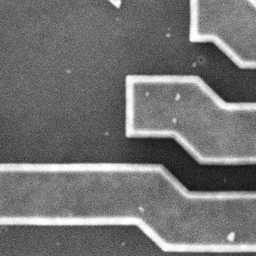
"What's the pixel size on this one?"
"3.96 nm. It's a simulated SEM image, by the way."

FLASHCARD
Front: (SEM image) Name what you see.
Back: groups of lines, slits or small figures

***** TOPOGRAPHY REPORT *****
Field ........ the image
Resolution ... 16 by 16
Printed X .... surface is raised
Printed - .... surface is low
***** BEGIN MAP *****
------------XXXX
------------XXXX
-------------XXX
--------------XX
----------------
--------XXXXX---
--------XXXXXX--
--------XXXXXXXX
-----------XXXXX
------------XXXX
XXXXXXXXXX------
XXXXXXXXXXX-----
XXXXXXXXXXXXXXXX
XXXXXXXXXXXXXXXX
---------XXXXXXX
-----------XXXXX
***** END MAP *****